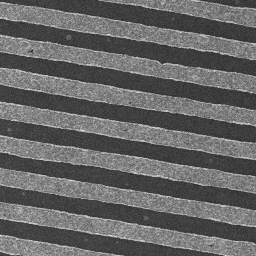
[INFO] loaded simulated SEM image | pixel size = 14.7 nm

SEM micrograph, parallel lines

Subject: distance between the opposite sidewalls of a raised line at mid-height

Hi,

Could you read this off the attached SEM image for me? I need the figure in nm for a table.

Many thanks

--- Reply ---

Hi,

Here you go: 234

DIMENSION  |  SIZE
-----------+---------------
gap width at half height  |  242 nm